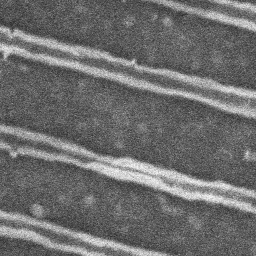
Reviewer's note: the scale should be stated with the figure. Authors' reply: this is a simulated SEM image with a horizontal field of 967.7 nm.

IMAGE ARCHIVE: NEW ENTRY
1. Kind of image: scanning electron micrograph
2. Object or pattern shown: one or a few lines or trenches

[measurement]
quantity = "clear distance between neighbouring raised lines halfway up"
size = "267 nm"